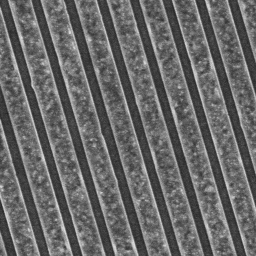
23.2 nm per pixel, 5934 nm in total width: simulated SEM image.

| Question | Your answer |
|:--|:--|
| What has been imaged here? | parallel lines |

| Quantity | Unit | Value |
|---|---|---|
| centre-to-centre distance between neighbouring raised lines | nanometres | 728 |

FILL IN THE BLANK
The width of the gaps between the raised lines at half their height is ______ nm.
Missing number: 228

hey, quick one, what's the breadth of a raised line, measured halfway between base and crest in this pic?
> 495 nanometres